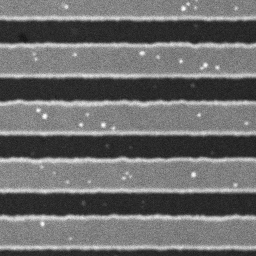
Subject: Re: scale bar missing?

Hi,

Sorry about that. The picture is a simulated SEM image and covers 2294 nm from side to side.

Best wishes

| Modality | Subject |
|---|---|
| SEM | lines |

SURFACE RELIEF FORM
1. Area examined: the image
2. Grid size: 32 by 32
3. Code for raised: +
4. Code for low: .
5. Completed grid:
++++++++++++++++++++++++++++++++
++++++++++++++++++++++++++++++++
..........................+.....
................................
................................
++++++++++++++++++++++++++++++++
++++++++++++++++++++++++++++++++
++++++++++++++++++++++++++++++++
++++++++++++++++++++++++++++++++
++++++++++++++++++++++++++++++++
................................
................................
................................
++++++++++++++++++++++++++++++++
++++++++++++++++++++++++++++++++
++++++++++++++++++++++++++++++++
++++++++++++++++++++++++++++++++
................................
................................
................................
++++++++++++++++++++++++++++++++
++++++++++++++++++++++++++++++++
++++++++++++++++++++++++++++++++
++++++++++++++++++++++++++++++++
................................
................................
................................
++++++++++++++++++++++++++++++++
++++++++++++++++++++++++++++++++
++++++++++++++++++++++++++++++++
++++++++++++++++++++++++++++++++
................................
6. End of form